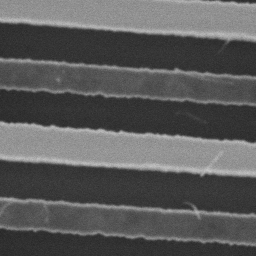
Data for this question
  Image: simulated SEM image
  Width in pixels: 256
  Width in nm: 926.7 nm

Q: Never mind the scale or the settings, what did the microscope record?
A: lines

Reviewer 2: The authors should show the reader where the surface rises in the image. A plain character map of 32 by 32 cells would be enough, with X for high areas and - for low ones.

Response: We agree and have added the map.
XXXXXXXXXXXXXXXXXXXXXXXXXXXXXXXX
XXXXXXXXXXXXXXXXXXXXXXXXXXXXXXXX
XXXXXXXXXXXXXXXXXXXXXXXXXXXXXXXX
----------XXXXXXXXXXXXXXXXXXXXXX
------------------------XXXXXXXX
--------------------------------
--------------------------------
XXXX----------------------------
XXXXXXXXXXXXXXXXX---------------
XXXXXXXXXXXXXXXXXXXXXXXXXXXXXXX-
XXXXXXXXXXXXXXXXXXXXXXXXXXXXXXXX
------XX-XXXXXXXXXXXXXXXXXXXXXXX
----------------------XXXXXXXXXX
--------------------------------
--------------------------------
XXXX----------------------------
XXXXXXXXXXXXXXXX----------------
XXXXXXXXXXXXXXXXXXXXXXXXXXX-XX--
XXXXXXXXXXXXXXXXXXXXXXXXXXXXXXXX
XXXXXXXXXXXXXXXXXXXXXXXXXXXXXXXX
--------XXXXXXXXXXXXXXXXXXXXXXXX
-----------------------XXXXXXXXX
--------------------------------
--------------------------------
--------------------------------
XXXXXXXXXXXX--------------------
XXXXXXXXXXXXXXXXXXXXXXXXXXXX----
XXXXXXXXXXXXXXXXXXXXXXXXXXXXXXXX
XXXXXXXXXXXXXXXXXXXXXXXXXXXXXXXX
---------------XXXXXXXXXXXXXXXXX
-----------------------------XXX
--------------------------------